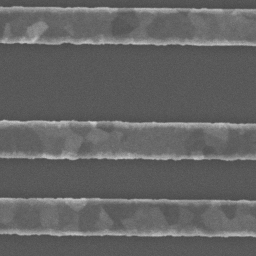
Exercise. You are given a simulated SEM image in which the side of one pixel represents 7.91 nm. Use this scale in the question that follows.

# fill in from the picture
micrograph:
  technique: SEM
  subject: lines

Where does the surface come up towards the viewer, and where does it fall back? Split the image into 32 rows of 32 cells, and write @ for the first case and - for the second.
--------------------------------
@@@@@@@@@@@@@@@@@@@@@@@@@@@@@@@@
@@@@@@@@@@@@@@@@@@@@@@@@@@@@@@@@
@@@@@@@@@@@@@@@@@@@@@@@@@@@@@@@@
@@@@@@@@@@@@@@@@@@@@@@@@@@@@@@@@
------------------------@@@@@@@@
--------------------------------
--------------------------------
--------------------------------
--------------------------------
--------------------------------
--------------------------------
--------------------------------
--------------------------------
--------------------------------
@@@@@@@@@@@@@@@@----------------
@@@@@@@@@@@@@@@@@@@@@@@@@@@@@@@@
@@@@@@@@@@@@@@@@@@@@@@@@@@@@@@@@
@@@@@@@@@@@@@@@@@@@@@@@@@@@@@@@@
@@-@@@@@@@@@@@@@@@@@@@@@@@@@@@@@
--------------------------------
--------------------------------
--------------------------------
--------------------------------
--------------------------------
@@@@@@@@@@@@@@@@@@@@@@@@@@@@@@@@
@@@@@@@@@@@@@@@@@@@@@@@@@@@@@@@@
@@@@@@@@@@@@@@@@@@@@@@@@@@@@@@@@
@@@@@@@@@@@@@@@@@@@@@@@@@@@@@@@@
--------------------------------
--------------------------------
--------------------------------